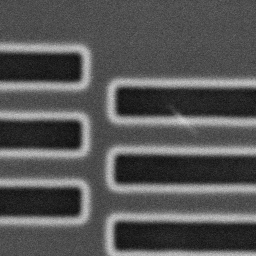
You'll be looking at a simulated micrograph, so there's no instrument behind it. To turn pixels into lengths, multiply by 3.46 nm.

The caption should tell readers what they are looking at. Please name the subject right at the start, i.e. groups of lines, slits or small figures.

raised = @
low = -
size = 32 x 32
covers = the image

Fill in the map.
@@@@@@@@@@@@@@@@@@@@@@@@@@@@@@@@
@@@@@@@@@@@@@@@@@@@@@@@@@@@@@@@@
@@@@@@@@@@@@@@@@@@@@@@@@@@@@@@@@
@@@@@@@@@@@@@@@@@@@@@@@@@@@@@@@@
@@@@@@@@@@@@@@@@@@@@@@@@@@@@@@@@
@@@@@@@@@@@@@@@@@@@@@@@@@@@@@@@@
----------@@@@@@@@@@@@@@@@@@@@@@
-----------@@@@@@@@@@@@@@@@@@@@@
-----------@@@@@@@@@@@@@@@@@@@@@
-----------@@@@@@@@@@@@@@@@@@@@@
----------@@@@@--@@@@@@@@@@@@@@@
@@@@@@@@@@@@@@------------------
@@@@@@@@@@@@@@------------------
@@@@@@@@@@@@@@------------------
@@@@@@@@@@@@@@------------------
----------@@@@@@@@@@@@@@@@@@@@@@
-----------@@@@@@@@@@@@@@@@@@@@@
-----------@@@@@@@@@@@@@@@@@@@@@
----------@@@@@@@@@@@@@@@@@@@@@@
@@@@@@@@@@@@@@------------------
@@@@@@@@@@@@@@------------------
@@@@@@@@@@@@@@------------------
@@@@@@@@@@@@@@------------------
----------@@@@@@@@@@@@@@@@@@@@@@
-----------@@@@@@@@@@@@@@@@@@@@@
-----------@@@@@@@@@@@@@@@@@@@@@
----------@@@@@@@@@@@@@@@@@@@@@@
@@@@@@@@@@@@@@------------------
@@@@@@@@@@@@@@------------------
@@@@@@@@@@@@@@------------------
@@@@@@@@@@@@@@------------------
@@@@@@@@@@@@@@------------------